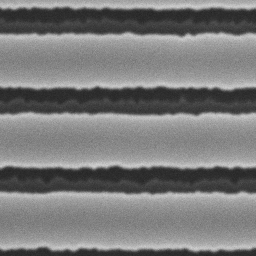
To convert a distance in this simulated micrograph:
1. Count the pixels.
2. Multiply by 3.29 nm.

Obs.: lines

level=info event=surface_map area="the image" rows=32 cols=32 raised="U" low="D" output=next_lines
UUUUUUUUUUUUUUUUUUUUUUUUUUUUUUUU
DDDDDDDDDDDDDDDDDDDDDDDDDDDDDDDD
DDDDDDDDDDDDDDDDDDDDDDDDDDDDDDDD
DDDDDDDDDDDDDDDDDDDDDDDDDDDDDDDD
UUUUUUUUUUUUUUUUUUUUUUDUUUUUUUUU
UUUUUUUUUUUUUUUUUUUUUUUUUUUUUUUU
UUUUUUUUUUUUUUUUUUUUUUUUUUUUUUUU
UUUUUUUUUUUUUUUUUUUUUUUUUUUUUUUU
UUUUUUUUUUUUUUUUUUUUUUUUUUUUUUUU
UUUUUUUUUUUUUUUUUUUUUUUUUUUUUUUU
UUUUUUUUUUUUUUUUUUUUUUUUUUUUUUUU
DDDDDDDDDDDDDDDDDDDDDDDDDDDDDDDD
DDDDDDDDDDDDDDDDDDDDDDDDDDDDDDDD
DDDDDDDDDDDDDDDDDDDDDDDDDDDDDDDD
UUUUUUUUUUUUUUUUUUUUUUUUUUUUUUUU
UUUUUUUUUUUUUUUUUUUUUUUUUUUUUUUU
UUUUUUUUUUUUUUUUUUUUUUUUUUUUUUUU
UUUUUUUUUUUUUUUUUUUUUUUUUUUUUUUU
UUUUUUUUUUUUUUUUUUUUUUUUUUUUUUUU
UUUUUUUUUUUUUUUUUUUUUUUUUUUUUUUU
UUUUUUUUUUUUUUUUUUUUUUUUUUUUUUUU
DDDDDDDDDDDDDDDDDDDDDDDDDDDDDDDD
DDDDDDDDDDDDDDDDDDDDDDDDDDDDDDDD
DDDDDDDDDDDDDDDDDDDDDDDDDDDDDDDD
UUUUUUUUUUUUUUUUUUUUUUUUUUUUUUUU
UUUUUUUUUUUUUUUUUUUUUUUUUUUUUUUU
UUUUUUUUUUUUUUUUUUUUUUUUUUUUUUUU
UUUUUUUUUUUUUUUUUUUUUUUUUUUUUUUU
UUUUUUUUUUUUUUUUUUUUUUUUUUUUUUUU
UUUUUUUUUUUUUUUUUUUUUUUUUUUUUUUU
UUUUUUUUUUUUUUUUUUUUUUUUUUUUUUUU
DDDDDDDDDDDDDDDDDDDDDDDDDDDDDDDD